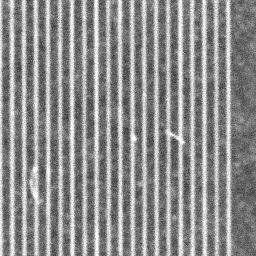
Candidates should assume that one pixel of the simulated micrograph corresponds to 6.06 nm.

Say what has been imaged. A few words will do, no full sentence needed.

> parallel lines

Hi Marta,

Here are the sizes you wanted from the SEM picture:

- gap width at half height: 59.8 nanometres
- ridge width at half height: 2.38 pixels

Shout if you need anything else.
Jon